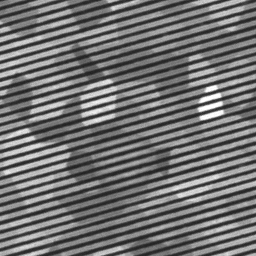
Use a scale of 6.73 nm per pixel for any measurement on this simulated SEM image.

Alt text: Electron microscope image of parallel lines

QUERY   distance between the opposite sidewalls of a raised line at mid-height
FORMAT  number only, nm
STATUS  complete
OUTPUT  30.8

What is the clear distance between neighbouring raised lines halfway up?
26.8 nm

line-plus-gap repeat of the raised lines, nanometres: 57.9